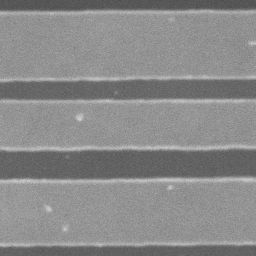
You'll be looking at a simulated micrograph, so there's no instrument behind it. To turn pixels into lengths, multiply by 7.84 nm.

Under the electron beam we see lines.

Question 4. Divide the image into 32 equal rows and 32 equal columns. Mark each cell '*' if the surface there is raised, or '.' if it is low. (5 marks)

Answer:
................................
..........**********************
********************************
********************************
********************************
********************************
********************************
********************************
********************************
********************************
................................
................................
................................
********************************
********************************
********************************
********************************
********************************
***************************.....
................................
................................
................................
....................***....*****
********************************
********************************
********************************
********************************
********************************
********************************
********************************
*******************.****.....*..
................................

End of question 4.